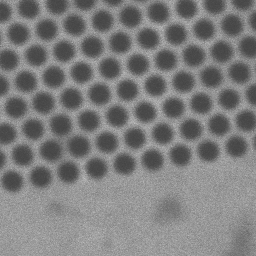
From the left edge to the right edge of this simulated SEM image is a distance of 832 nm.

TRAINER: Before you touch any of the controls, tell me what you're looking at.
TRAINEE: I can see a regular array of holes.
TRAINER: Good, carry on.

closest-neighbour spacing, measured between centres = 0.0901 µm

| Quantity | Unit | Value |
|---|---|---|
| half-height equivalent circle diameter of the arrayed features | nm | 70.6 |